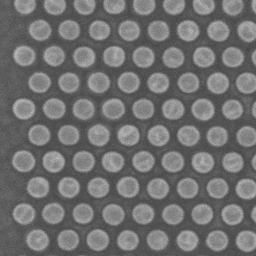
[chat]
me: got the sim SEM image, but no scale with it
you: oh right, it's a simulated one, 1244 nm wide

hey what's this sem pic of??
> a regular array of raised bodies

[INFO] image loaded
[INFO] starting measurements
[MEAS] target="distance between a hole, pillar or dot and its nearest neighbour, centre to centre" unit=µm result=0.143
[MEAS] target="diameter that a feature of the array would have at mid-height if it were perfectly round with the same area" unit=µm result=0.0969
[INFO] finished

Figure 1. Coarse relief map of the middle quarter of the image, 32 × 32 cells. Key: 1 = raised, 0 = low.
00001100000010000001100000111000
00000000000000000000000000000000
11000001100000011000000100000011
11100001111000111100011111000111
11110011111000111110011111000111
11110011111000111100011111000111
11100001110000011100001110000111
00000000000000000000000000000000
00000000000000000000000000000000
00011100000111000011110000111000
00011110001111100111110001111100
00011110001111100111110001111100
00011110001111100011110001111100
00001100000111000001100000111000
00000000000000000000000000000000
11000000100000011000000000000000
11100011111000111100001110000111
11110011111000111110011111000111
11100011111000111100011111000111
11100001111000111100001110000111
00000000000000000000000000000000
00000000000000000000000000000000
00011100000110000011110000111000
00111110001111100111110001111100
00111110001111100111110001111100
00011110001111000011110001111100
00011100000110000001100000111000
00000000000000000000000000000000
00000000000000011000000000000000
11100001111000111100001110000111
11110011111001111100011111001111
11110011111001111100011111001111